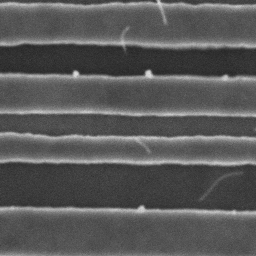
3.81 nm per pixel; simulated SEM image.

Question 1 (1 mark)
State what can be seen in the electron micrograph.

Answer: lines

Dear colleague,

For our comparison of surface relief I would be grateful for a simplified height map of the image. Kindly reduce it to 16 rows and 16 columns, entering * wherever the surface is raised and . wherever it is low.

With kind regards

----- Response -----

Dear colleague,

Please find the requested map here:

****************
****************
****************
................
................
****************
****************
****************
****************
****************
................
................
................
****************
****************
****************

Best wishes